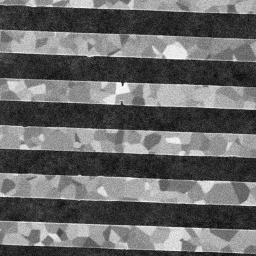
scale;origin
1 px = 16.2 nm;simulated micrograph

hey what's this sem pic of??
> parallel lines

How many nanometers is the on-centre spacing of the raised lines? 775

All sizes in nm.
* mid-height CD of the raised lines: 372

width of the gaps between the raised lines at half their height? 409 nanometres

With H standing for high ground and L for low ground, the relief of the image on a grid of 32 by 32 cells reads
HHHHHHHHHHHHHHHHHHHHHHHHHHHHHHHH
LLLLLLLLLLLLLLLLLLLLLLLLLHHHHHHH
LLLLLLLLLLLLLLLLLLLLLLLLLLLLLLLL
LLLLLLLLLLLLLLLLLLLLLLLLLLLLLLLL
HHHHHHHHHHHHHHHHHHHLLLLLLLLLLLLL
HHHHHHHHHHHHHHHHHHHHHHHHHHHHHHHH
HHHHHHHHHHHHHHHHHHHHHHHHHHHHHHHH
LLLLLLLLLLLLLLLLLLLLLLLLLLLHHHHH
LLLLLLLLLLLLLLLLLLLLLLLLLLLLLLLL
LLLLLLLLLLLLLLLLLLLLLLLLLLLLLLLL
HHHHHHHHHHHHHHHLHHHLLLLLLLLLLLLL
HHHHHHHHHHHHHHHHHHHHHHHHHHHHHHHH
LHHHHHHHHHHHHHHHHHHHHHHHHHHHHHHH
LLLLLLLLLLLLLLLLLLLLLLLLLLLLHHHH
LLLLLLLLLLLLLLLLLLLLLLLLLLLLLLLL
LLLLLLLLLLLLLLLLLLLLLLLLLLLLLLLL
HHHHHHHHHHHHHHHHHHHHHLLLLLLLLLLL
HHHHHHHHHHHHHHHHHHHHHHHHHHHHHHHH
HHHHHHHHHHHHHHHHHHHHHHHHHHHHHHHH
LLLLLLLLLLLLLLLLLLLLLLLLLLLHHHHH
LLLLLLLLLLLLLLLLLLLLLLLLLLLLLLLL
LLLLLLLLLLLLLLLLLLLLLLLLLLLLLLLL
HHHHHHHHHHHHHHHHHHHHHHLLLLLLLLLL
HHHHHHHHHHHHHHHHHHHHHHHHHHHHHHHH
HHHHHHHHHHHHHHHHHHHHHHHHHHHHHHHH
LLLLLLLLLLLLLLLLLLLLLLLLLHHHHHHH
LLLLLLLLLLLLLLLLLLLLLLLLLLLLLLLL
LLLLLLLLLLLLLLLLLLLLLLLLLLLLLLLL
HHHHHHHHHHHHHHHHHHHHHHHLLLLLLLLL
HHHHHHHHHHHHHHHHHHHHHHHHHHHHHHHH
HHHHHHHHHHHHHHHHHHHHHHHHHHHHHHHH
LLLLLLLLLLLLLLLLLLLLLLLLLLLHHHHH